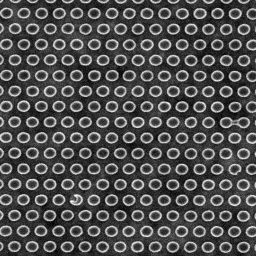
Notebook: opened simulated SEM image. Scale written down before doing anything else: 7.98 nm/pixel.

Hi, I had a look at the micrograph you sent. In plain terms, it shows a regular array of raised bodies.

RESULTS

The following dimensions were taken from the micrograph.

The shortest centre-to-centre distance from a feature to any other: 139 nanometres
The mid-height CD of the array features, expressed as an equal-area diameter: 88.6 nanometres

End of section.